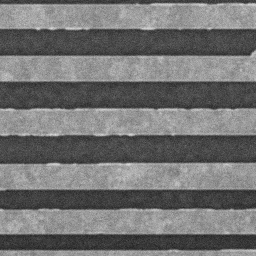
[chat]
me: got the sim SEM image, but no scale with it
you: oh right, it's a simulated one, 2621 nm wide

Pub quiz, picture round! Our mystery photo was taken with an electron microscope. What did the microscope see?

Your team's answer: lines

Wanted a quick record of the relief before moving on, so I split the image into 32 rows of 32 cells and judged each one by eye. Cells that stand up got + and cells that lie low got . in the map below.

................................
++++++++++++++++++++++++++++++++
++++++++++++++++++++++++++++++++
....+.+.++.......+++......+.....
................................
................................
................................
++++++++++++++++++++++++++++++++
++++++++++++++++++++++++++++++++
++++++++++++++++++++++++++++++++
................................
................................
................................
................................
++++++++++++++++++++++++++++++++
++++++++++++++++++++++++++++++++
++++++++++++++++++++++++++++++++
................................
................................
................................
......++....++++++++++++++++++++
++++++++++++++++++++++++++++++++
++++++++++++++++++++++++++++++++
++++++++++++++++++++++++++++++++
................................
................................
++++++++++++++++++++++++++++++++
++++++++++++++++++++++++++++++++
++++++++++++++++++++++++++++++++
................................
................................
++++++++++++++++++++++++++++++++